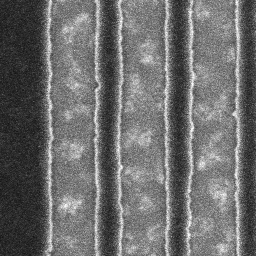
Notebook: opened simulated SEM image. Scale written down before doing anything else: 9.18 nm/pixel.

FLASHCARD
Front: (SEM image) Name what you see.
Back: one or a few lines or trenches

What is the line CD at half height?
228 nm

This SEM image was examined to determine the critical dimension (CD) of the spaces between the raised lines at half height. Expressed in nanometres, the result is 414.